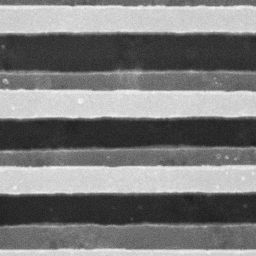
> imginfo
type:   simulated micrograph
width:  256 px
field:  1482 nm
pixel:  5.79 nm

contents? lines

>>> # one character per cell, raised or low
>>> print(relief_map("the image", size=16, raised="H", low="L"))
HHHHHHHHHHHHHHHH
HHHHHHHHHHHHHHHH
LLLLLLLLLLLLLLLL
LLLLLLLLLLLLLLLL
LLLLLLLLLLLHHLLL
HHHHHHHHHHHHHHHH
HHHHHHHHHHHHHHHH
LLLLLLLLLLLLLLLL
LLLLLLLLLLLLLLLL
HHHHHHHHHHHHHHHH
HHHHHHHHHHHHHHHH
HHHHHHHHHHHHHHHH
LLLLLLLLLLLLLLLL
LLLLLLLLLLLLLLLL
HHHHHHHHHHHHHHHH
HHHHHHHHHHHHHHHH